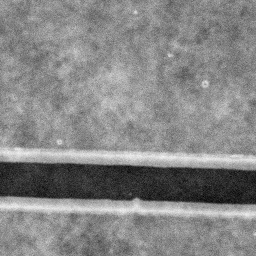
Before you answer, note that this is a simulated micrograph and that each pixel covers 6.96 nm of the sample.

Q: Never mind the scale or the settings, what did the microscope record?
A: one or a few lines or trenches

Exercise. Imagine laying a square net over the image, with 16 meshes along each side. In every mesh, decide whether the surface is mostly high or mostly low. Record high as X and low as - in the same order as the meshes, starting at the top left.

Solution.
XXXXXXXXXXXXXXXX
XXXXXXXXXXXXXXXX
XXXXXXXXXXXXXXXX
XXXXXXXXXXXXXXXX
XXXXXXXXXXXXXXXX
XXXXXXXXXXXXXXXX
XXXXXXXXXXXXXXXX
XXXXXXXXXXXXXXXX
XXXXXXXXXXXXXXXX
XXXXXXXXXXXXXXXX
----------------
----------------
----------------
XXXXXXXXXXXXXXXX
XXXXXXXXXXXXXXXX
XXXXXXXXXXXXXXXX